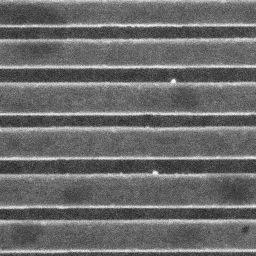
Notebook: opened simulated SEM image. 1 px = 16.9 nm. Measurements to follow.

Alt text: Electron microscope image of lines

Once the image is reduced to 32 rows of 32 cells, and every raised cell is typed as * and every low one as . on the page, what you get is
********************************
********************************
********************************
................................
................................
********************************
********************************
********************************
................................
................................
.....................*..........
********************************
********************************
********************************
................................
................................
********************************
********************************
********************************
********************************
................................
................................
********************************
********************************
********************************
********************************
................................
................................
********************************
********************************
********************************
................................